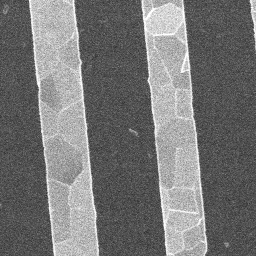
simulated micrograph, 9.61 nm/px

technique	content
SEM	one or a few lines or trenches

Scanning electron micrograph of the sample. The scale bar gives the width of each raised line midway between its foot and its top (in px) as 42.2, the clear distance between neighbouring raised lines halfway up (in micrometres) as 0.654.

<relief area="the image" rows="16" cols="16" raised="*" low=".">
..***....**.....
..***....***....
..***....***....
..***....***....
..***....***....
..***....***....
..***.....**....
...**.....**....
...**.....**....
...***....**....
...***....**....
...***....***...
...***....***...
...***....***...
...***....***...
...***....***...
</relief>